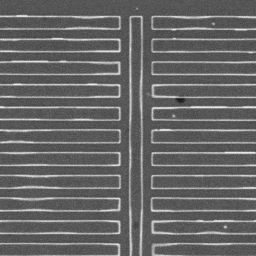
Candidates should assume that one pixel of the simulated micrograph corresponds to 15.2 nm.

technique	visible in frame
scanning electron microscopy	groups of lines, slits or small figures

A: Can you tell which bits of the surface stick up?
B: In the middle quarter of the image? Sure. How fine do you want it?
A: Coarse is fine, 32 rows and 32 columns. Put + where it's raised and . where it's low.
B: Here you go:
++++++++++++++...++...++++++++++
++++++++++++++...++...++++++++++
++++.............++....+++++++++
.................++.............
.................++.............
++++++++++++++...++...++++++++++
++++++++++++++...++...++++++++++
++++++++++++++...++...++++++++++
.................++.............
.................++.............
.................++.............
++++++++++++++...++...++++++++++
++++++++++++++...++...++++++++++
++++++++++++++...++...++++++++++
.................++.............
.................++.............
................+++.............
++++++++++++++..+++...++++++++++
++++++++++++++..+++...++++++++++
++++++++++++++..+++...++++++++++
.................++.............
.................++.............
++++++++++++++...++...++++++++++
++++++++++++++...++...++++++++++
++++++++++++++...++...++++++++++
.................++.............
................+++.............
................+++.............
++++++++++++++..+++...++++++++++
++++++++++++++..+++...++++++++++
++++++++++++++..+++...++++++++++
................+++.............